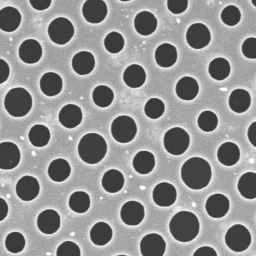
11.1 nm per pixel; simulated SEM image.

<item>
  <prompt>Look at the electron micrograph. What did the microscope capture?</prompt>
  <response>a regular array of holes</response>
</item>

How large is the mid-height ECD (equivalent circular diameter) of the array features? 259 nm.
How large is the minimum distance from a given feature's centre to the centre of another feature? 409 nanometers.